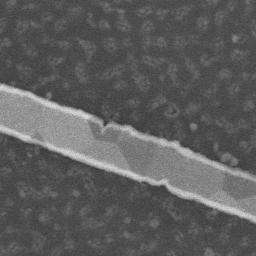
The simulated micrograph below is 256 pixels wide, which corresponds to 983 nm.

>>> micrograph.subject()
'one or a few lines or trenches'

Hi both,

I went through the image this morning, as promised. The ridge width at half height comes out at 148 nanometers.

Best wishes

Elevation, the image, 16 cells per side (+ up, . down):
................
................
................
................
................
................
+++.............
++++++..........
.++++++++.......
....++++++++....
.......+++++++..
..........++++++
.............+++
................
................
................